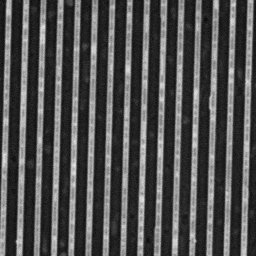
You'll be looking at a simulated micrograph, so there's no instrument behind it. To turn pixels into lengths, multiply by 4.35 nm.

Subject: parallel lines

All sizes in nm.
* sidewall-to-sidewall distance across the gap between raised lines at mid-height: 53.8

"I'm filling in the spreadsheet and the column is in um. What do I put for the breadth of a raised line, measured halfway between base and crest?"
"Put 0.0228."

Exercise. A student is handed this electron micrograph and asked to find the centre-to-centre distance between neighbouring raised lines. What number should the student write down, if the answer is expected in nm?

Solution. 75